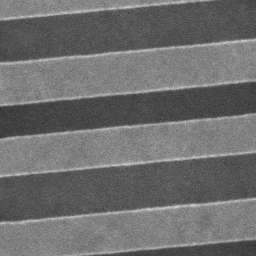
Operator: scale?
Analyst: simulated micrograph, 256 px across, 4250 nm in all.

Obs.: lines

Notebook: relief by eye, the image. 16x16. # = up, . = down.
########........
................
................
......##########
################
###########.....
#...............
............####
..##############
################
######..........
................
...............#
.....###########
################
##########......